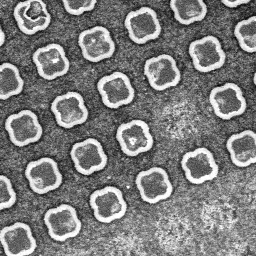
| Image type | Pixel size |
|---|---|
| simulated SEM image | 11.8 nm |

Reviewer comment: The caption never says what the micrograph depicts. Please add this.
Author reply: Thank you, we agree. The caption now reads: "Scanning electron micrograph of a regular array of raised bodies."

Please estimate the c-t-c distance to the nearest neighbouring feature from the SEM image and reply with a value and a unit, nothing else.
49.2 px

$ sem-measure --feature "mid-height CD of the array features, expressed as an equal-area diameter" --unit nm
373